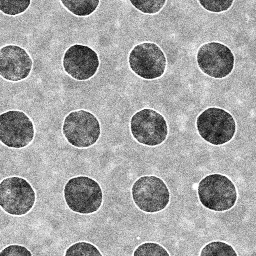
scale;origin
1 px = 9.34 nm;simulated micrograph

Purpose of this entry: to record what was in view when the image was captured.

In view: a regular array of holes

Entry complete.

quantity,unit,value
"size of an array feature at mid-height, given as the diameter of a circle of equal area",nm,351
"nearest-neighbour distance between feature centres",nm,620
